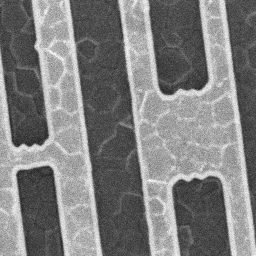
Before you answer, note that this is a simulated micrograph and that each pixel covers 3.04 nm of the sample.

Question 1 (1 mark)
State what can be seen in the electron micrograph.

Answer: one or a few lines or trenches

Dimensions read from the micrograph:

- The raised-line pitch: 243 nanometres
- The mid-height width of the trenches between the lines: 155 nm